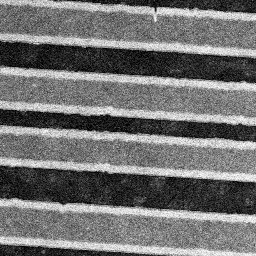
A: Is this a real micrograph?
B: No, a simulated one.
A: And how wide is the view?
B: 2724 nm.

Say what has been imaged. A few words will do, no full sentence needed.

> one or a few lines or trenches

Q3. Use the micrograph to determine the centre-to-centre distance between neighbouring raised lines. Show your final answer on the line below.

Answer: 67.1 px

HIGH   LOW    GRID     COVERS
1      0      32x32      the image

11111100000000000000000000000000
11111111111111111111100000000000
11111111111111111111111111111111
11111111111111111111111111111111
11111111111111111111111111111111
00000000000000011111111111111111
00000000000000000000000000000001
00000000000000000000000000000000
00000000000000000000000000000000
11111111100000000000000000000000
11111111111111111111111100000000
11111111111111111111111111111111
11111111111111111111111111111111
00000001111111111111111111111111
00000000000000000000011111111111
00000000000000000000000000000000
11111000000000000000000000000000
11111111111111111111000000000000
11111111111111111111111111111111
11111111111111111111111111111111
00000111111111111111111111111111
00000000000000000000011111111111
00000000000000000000000000000000
00000000000000000000000000000000
00000000000000000000000000000000
11100000000000000000000000000000
11111111111111110000000000000000
11111111111111111111111111111111
11111111111111111111111111111111
11111111111111111111111111111111
00000000111111111111111111111111
00000000000000000000000011111111